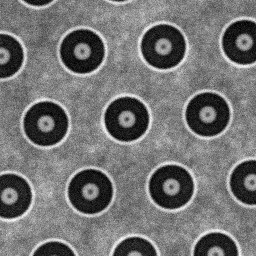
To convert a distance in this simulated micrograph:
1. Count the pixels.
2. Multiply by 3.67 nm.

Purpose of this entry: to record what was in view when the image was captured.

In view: an array of small figures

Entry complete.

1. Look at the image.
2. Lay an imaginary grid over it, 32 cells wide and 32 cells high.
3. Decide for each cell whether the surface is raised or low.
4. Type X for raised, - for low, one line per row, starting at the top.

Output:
XXX---XXXXXXXXXXXXXXXXXXXXXXXXXX
XXXXXXXXXXXXXXXXXXXXXXXXXXXXXXXX
XXXXXXXXXXXXXXXXXXXXXXXXXXXXXX-X
XXXXXXXXXXXXXXXXXXX---XXXXXX----
--XXXXXX----XXXXXX-----XXXXX----
---XXXXX-----XXXX---X--XXXXX--X-
X--XXXX---X--XXXXX--X--XXXXX----
X--XXXXX-----XXXXX-----XXXXXX---
---XXXXX----XXXXXXX---XXXXXXXXXX
--XXXXXXXXXXXXXXXXXXXXXXXXXXXXXX
XXXXXXXXXXXXXXXXXXXXXXXXXXXXXXXX
XXXXXXXXXXXXXXXXXXXXXXXXX--XXXXX
XXXXXXXXXXXXXX----XXXXXX----XXXX
XXXX----XXXXX-----XXXXX------XXX
XXX------XXXX--X---XXXX--XX--XXX
XXX--X---XXXX------XXXX------XXX
XXX-----XXXXX-----XXXXXX----XXXX
XXXX----XXXXXX---XXXXXXXXXXXXXXX
XXXXXXXXXXXXXXXXXXXXXXXXXXXXXXXX
XXXXXXXXXXXXXXXXXXXXXXXXXXXXXXXX
XXXXXXXXXXXXXXXXXXXXX-XXXXXXXX--
XXXXXXXXXX---XXXXXX-----XXXXX---
---XXXXXX-----XXXXX-----XXXXX--X
----XXXX---X--XXXX---X--XXXXX--X
XX--XXXX---X--XXXXX-----XXXXX---
----XXXXX-----XXXXX----XXXXXXX--
---XXXXXXX---XXXXXXXXXXXXXXXXXXX
XXXXXXXXXXXXXXXXXXXXXXXXXXXXXXXX
XXXXXXXXXXXXXXXXXXXXXXXXXXXXXXXX
XXXXXXXXXXXXXXXXXXXXXXXXX----XXX
XXXXX---XXXXXXX----XXXXX------XX
XXXX-----XXXXX------XXXX--XX--XX